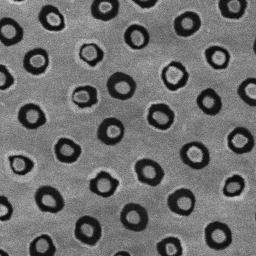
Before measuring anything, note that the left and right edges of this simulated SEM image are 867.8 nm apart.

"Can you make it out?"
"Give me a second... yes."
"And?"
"a regular array of ring-shaped grooves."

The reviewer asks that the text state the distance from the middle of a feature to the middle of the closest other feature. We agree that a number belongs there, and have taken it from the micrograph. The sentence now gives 155 nm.